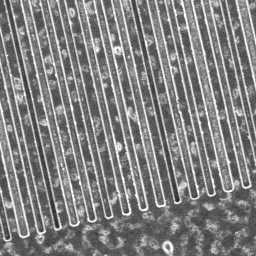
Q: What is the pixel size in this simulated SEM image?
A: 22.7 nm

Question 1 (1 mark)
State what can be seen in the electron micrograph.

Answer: parallel lines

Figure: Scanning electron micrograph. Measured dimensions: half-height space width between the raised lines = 149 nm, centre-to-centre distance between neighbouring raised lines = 396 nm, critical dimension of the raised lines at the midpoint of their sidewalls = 235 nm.